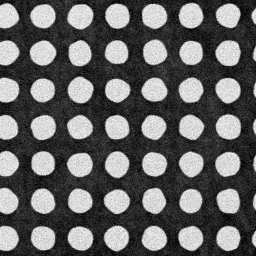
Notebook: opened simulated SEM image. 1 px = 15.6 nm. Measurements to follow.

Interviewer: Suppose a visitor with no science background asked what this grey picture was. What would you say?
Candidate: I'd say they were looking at an array of small figures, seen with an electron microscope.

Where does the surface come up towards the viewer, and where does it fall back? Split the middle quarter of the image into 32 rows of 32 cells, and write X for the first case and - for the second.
--------------------------------
--------------------------------
--------------------------------
---XX---------------------------
--XXXXX----XXXX------XXXX-----XX
-XXXXXX----XXXXX----XXXXX----XXX
-XXXXXX---XXXXXX----XXXXXX---XXX
-XXXXXX---XXXXXX----XXXXXX---XXX
--XXXXX----XXXX-----XXXXX----XXX
---XX---------------------------
--------------------------------
--------------------------------
--------------------------------
--XXXX-----XXXX------XXX------XX
-XXXXXX----XXXXX----XXXXX----XXX
-XXXXXX---XXXXXX---XXXXXX----XXX
-XXXXXX----XXXXX---XXXXXX----XXX
--XXXXX----XXXXX----XXXXX----XXX
--XXX-------XXX------XXX-------X
--------------------------------
--------------------------------
--------------------------------
---XXX------XXX------XXX------XX
--XXXXX----XXXXX----XXXXX----XXX
-XXXXXX---XXXXXX----XXXXXX---XXX
-XXXXXX---XXXXXX----XXXXXX---XXX
-XXXXXX----XXXXX----XXXXX----XXX
--XXXX------XXX------XXX------XX
--------------------------------
--------------------------------
--------------------------------
---XX----------------XXX--------